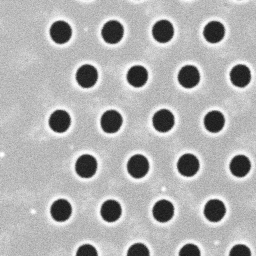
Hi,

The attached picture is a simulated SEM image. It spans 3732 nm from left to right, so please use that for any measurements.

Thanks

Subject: a regular array of holes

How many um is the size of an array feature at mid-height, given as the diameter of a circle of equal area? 0.35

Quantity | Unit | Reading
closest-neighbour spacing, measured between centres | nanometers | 743